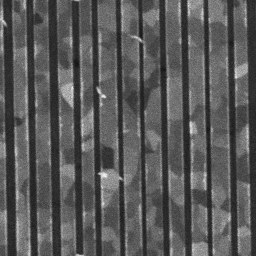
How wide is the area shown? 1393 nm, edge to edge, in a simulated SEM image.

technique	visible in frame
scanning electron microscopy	parallel lines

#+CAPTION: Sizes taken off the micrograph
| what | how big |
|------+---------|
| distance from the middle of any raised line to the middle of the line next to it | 120 nm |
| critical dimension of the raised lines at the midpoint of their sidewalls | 0.083 microns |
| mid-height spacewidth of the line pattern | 39.4 nanometres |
